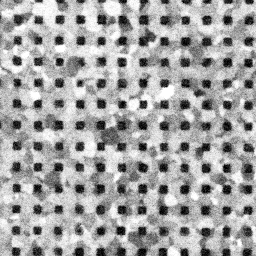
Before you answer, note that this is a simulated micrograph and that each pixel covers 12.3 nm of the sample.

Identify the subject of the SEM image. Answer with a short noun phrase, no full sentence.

a regular array of holes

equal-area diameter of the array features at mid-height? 126 nanometres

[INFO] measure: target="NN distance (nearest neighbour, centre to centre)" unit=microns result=0.256